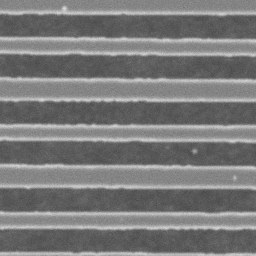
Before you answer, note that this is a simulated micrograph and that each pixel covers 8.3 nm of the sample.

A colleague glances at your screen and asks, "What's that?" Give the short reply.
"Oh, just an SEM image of lines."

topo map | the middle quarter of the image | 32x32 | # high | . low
................................
................................
................................
................................
################################
################################
################################
################################
################################
................................
................................
................................
................................
................................
................................
################################
################################
################################
################################
................................
................................
................................
................................
................................
................................
#############################.##
################################
################################
################################
################################
################################
................................